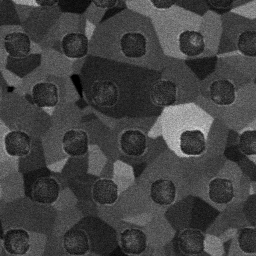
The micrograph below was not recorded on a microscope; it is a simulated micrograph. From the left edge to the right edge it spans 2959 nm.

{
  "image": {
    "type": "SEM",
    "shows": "a regular array of holes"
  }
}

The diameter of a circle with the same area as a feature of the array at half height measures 312 nm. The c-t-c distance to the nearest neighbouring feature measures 56.5 px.